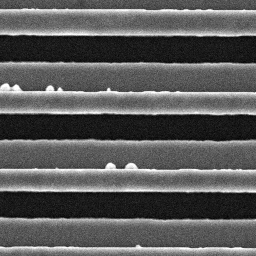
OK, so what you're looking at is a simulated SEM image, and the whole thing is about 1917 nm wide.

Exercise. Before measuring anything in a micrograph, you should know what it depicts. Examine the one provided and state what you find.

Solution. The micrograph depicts lines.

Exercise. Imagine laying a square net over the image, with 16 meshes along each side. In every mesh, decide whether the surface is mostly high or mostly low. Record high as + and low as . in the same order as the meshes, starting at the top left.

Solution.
++++++++++++++++
++++++++++++++++
................
................
++++++++++++++++
++++++++++++++++
++++++++++++++++
................
................
++++++++++++++++
++++++++++++++++
++++++++++++++++
................
................
++++++++++++++++
++++++++++++++++